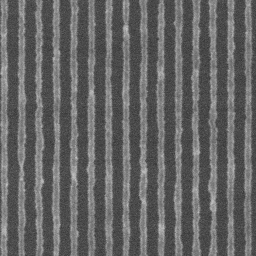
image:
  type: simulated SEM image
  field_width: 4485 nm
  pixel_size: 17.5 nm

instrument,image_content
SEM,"parallel lines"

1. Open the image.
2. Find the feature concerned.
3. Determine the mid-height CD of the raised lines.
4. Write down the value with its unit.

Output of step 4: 87.6 nanometers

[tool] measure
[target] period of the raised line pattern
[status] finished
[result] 306 nm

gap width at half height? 217 nm